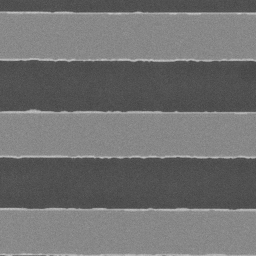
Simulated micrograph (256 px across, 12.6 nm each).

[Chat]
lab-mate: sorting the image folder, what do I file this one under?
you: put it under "lines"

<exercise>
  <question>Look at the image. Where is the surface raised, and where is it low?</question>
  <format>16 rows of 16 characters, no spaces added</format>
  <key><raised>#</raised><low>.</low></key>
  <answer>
................
################
################
################
................
................
................
################
################
################
................
................
................
################
################
################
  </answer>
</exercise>